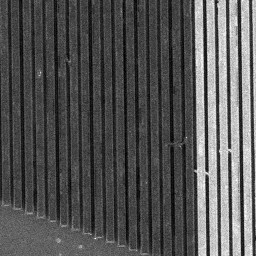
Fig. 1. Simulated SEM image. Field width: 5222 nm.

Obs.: parallel lines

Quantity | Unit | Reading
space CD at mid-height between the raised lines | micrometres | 0.0816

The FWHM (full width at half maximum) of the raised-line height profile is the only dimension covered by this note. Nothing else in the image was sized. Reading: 7 px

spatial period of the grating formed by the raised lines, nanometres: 234